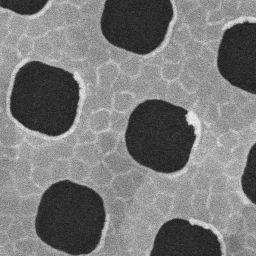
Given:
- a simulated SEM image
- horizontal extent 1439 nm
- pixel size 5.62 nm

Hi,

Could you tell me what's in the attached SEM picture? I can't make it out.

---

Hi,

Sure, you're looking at holes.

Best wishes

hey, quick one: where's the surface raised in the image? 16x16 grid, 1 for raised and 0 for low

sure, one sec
0001110000011111
1111110000011110
1111111000111100
1111111111111100
1000111111111100
1000011111111110
1000011110011111
1000011100001111
1111111100001111
1111111100001111
1111111110011110
1110011111111110
1110001111111111
1100000111111111
1100001111000111
1110001111000011